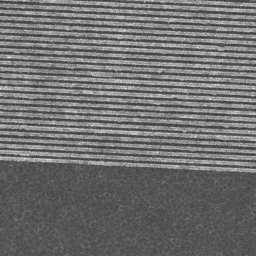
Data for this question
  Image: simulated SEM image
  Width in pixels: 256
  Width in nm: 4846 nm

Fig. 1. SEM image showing parallel lines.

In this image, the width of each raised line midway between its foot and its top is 0.0614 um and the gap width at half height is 61.4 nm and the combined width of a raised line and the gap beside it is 121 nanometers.